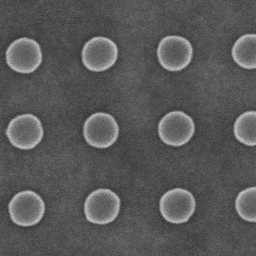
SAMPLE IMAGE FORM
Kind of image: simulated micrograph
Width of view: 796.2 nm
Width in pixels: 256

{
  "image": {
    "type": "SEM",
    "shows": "a regular array of raised bodies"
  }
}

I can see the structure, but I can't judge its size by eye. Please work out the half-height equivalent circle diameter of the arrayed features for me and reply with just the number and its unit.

0.108 microns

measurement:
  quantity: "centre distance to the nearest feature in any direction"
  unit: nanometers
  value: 234